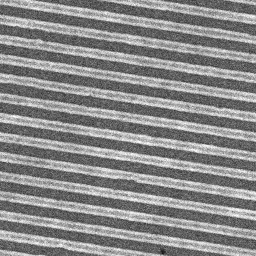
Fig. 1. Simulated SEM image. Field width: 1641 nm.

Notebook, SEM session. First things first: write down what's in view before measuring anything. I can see parallel lines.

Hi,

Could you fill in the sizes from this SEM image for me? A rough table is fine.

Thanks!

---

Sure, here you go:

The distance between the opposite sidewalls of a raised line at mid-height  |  0.0435 µm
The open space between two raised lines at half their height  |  82.3 nm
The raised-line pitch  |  19.3 px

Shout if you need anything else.